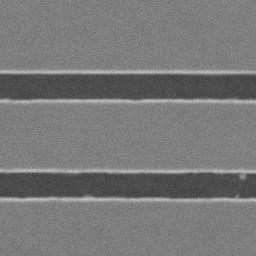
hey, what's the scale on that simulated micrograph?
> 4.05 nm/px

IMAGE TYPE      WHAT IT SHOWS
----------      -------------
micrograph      lines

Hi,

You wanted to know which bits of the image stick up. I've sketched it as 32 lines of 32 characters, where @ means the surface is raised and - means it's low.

@@@@@@@@@@@@@@@@@@@@@@@@@@@@@@@@
@@@@@@@@@@@@@@@@@@@@@@@@@@@@@@@@
@@@@@@@@@@@@@@@@@@@@@@@@@@@@@@@@
@@@@@@@@@@@@@@@@@@@@@@@@@@@@@@@@
@@@@@@@@@@@@@@@@@@@@@@@@@@@@@@@@
@@@@@@@@@@@@@@@@@@@@@@@@@@@@@@@@
@@@@@@@@@@@@@@@@@@@@@@@@@@@@@@@@
@@@@@@@@@@@@@@@@@@@@@@@@@@@@@@@@
@@@@@@@@@@@@@@@@@@@@@@@@@@@@@@@@
--------------------------------
--------------------------------
--------------------------------
@---@@@@@@@@@@@@@-@@@@@@@@@@@---
@@@@@@@@@@@@@@@@@@@@@@@@@@@@@@@@
@@@@@@@@@@@@@@@@@@@@@@@@@@@@@@@@
@@@@@@@@@@@@@@@@@@@@@@@@@@@@@@@@
@@@@@@@@@@@@@@@@@@@@@@@@@@@@@@@@
@@@@@@@@@@@@@@@@@@@@@@@@@@@@@@@@
@@@@@@@@@@@@@@@@@@@@@@@@@@@@@@@@
@@@@@@@@@@@@@@@@@@@@@@@@@@@@@@@@
@@@@@@@@@@@@@@@@@@@@@@@@@@@@@@@@
--------@@---@@@@@-@@@@@--@@@@@@
--------------------------------
--------------------------------
--------------------------------
@@@@@@@@@@@@@@@@@@@@@@@@@@@@@@@@
@@@@@@@@@@@@@@@@@@@@@@@@@@@@@@@@
@@@@@@@@@@@@@@@@@@@@@@@@@@@@@@@@
@@@@@@@@@@@@@@@@@@@@@@@@@@@@@@@@
@@@@@@@@@@@@@@@@@@@@@@@@@@@@@@@@
@@@@@@@@@@@@@@@@@@@@@@@@@@@@@@@@
@@@@@@@@@@@@@@@@@@@@@@@@@@@@@@@@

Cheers